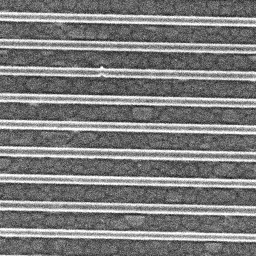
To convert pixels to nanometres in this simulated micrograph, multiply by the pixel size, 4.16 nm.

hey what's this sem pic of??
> parallel lines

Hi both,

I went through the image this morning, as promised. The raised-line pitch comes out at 112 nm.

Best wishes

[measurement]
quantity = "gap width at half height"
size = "0.0817 microns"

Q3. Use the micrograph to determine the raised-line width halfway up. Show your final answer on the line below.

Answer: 0.0328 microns